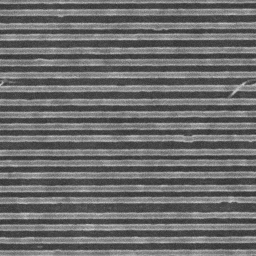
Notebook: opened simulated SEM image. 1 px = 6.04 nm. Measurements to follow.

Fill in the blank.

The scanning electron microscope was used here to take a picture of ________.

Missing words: parallel lines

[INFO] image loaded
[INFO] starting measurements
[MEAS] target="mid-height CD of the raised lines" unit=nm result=35.5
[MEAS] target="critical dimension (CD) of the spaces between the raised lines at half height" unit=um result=0.0415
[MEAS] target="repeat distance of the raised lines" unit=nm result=76.3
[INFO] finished